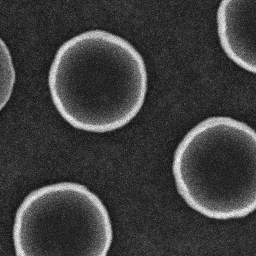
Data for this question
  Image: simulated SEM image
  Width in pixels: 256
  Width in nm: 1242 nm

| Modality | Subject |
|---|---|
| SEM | raised bodies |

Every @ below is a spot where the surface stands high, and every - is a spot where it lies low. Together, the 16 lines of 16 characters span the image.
--------------@@
--------------@@
-----@@-------@@
----@@@@@------@
---@@@@@@-------
---@@@@@@-------
----@@@@@-------
----@@@@--------
------------@@@@
-----------@@@@@
-----------@@@@@
-----------@@@@@
--@@@@------@@@@
-@@@@@@---------
-@@@@@@---------
-@@@@@@---------